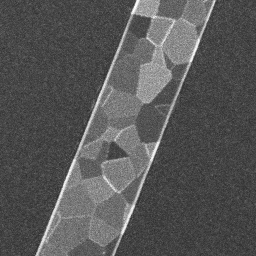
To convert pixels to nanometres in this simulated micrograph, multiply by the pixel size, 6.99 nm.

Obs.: one or a few lines or trenches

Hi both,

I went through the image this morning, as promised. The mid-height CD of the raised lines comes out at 0.504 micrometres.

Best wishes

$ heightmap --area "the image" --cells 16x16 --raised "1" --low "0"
0000000011111000
0000000011111000
0000000011110000
0000000111110000
0000000111110000
0000001111100000
0000001111100000
0000001111000000
0000011111000000
0000011111000000
0000111110000000
0000111110000000
0000111110000000
0001111100000000
0001111100000000
0011111000000000